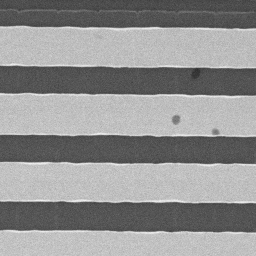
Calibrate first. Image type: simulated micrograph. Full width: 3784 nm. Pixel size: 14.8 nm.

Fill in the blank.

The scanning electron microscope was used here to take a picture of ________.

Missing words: wiring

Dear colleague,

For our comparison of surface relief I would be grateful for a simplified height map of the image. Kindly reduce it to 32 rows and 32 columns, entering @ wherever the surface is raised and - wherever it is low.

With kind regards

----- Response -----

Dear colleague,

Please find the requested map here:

--------------------------------
--------------------------------
--------------------------------
@@@@@@@-------------------------
@@@@@@@@@@@@@@@@@@@@@@@@@@@@@@@@
@@@@@@@@@@@@@@@@@@@@@@@@@@@@@@@@
@@@@@@@@@@@@@@@@@@@@@@@@@@@@@@@@
@@@@@@@@@@@@@@@@@@@@@@@@@@@@@@@@
--------------------------------
--------------------------------
--------------------------------
--------------------------------
@@@@@@@@@@@@@@@@@@@@@@@@@@@@@@@@
@@@@@@@@@@@@@@@@@@@@@@@@@@@@@@@@
@@@@@@@@@@@@@@@@@@@@@@@@@@@@@@@@
@@@@@@@@@@@@@@@@@@@@@@@@@@@@@@@@
@@@@@@@@@@@@@@@@@@@@@@@@@@@@@@@@
--------------------------------
--------------------------------
--------------------------------
@@@@@@@@@@@@@@------@@@---------
@@@@@@@@@@@@@@@@@@@@@@@@@@@@@@@@
@@@@@@@@@@@@@@@@@@@@@@@@@@@@@@@@
@@@@@@@@@@@@@@@@@@@@@@@@@@@@@@@@
@@@@@@@@@@@@@@@@@@@@@@@@@@@@@@@@
--------------------------------
--------------------------------
--------------------------------
--------------------------------
@@@@@@@@@@@@@@@@@@@@@@@@@@@@@@@@
@@@@@@@@@@@@@@@@@@@@@@@@@@@@@@@@
@@@@@@@@@@@@@@@@@@@@@@@@@@@@@@@@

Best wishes